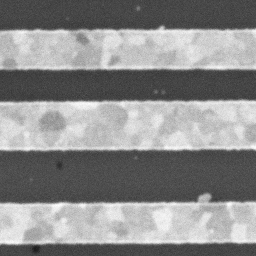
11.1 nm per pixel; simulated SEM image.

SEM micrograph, lines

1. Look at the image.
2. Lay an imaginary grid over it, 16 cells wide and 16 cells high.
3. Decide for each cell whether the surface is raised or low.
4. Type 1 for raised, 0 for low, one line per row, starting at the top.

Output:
0000000000000000
0000000000000000
1111111111111111
1111111111111111
0000000000000000
0000000000000000
1111111111111111
1111111111111111
1111111111111111
0000000000000000
0000000000000000
0000000000000000
0000000000000000
1111111111111111
1111111111111111
0000000000000000